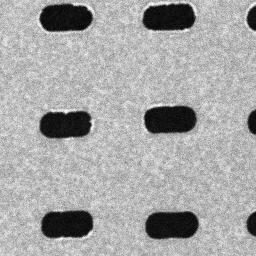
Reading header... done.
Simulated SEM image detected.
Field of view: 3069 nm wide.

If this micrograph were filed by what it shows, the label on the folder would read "holes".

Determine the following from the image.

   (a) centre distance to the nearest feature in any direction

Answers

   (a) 102 pixels